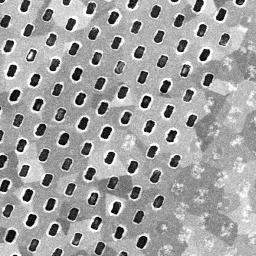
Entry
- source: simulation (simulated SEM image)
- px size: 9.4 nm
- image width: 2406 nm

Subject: a regular array of holes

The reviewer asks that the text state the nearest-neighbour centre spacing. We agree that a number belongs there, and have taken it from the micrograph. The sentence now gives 231 nm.